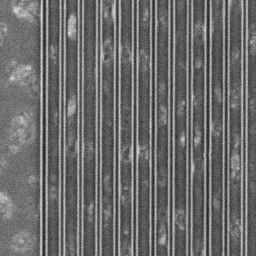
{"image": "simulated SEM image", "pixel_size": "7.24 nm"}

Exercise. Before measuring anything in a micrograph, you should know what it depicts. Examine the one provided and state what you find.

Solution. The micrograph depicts parallel lines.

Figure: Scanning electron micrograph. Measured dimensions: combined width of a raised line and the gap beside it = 132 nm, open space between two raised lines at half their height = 0.0969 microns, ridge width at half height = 36.2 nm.